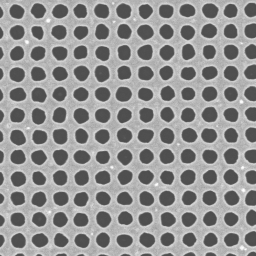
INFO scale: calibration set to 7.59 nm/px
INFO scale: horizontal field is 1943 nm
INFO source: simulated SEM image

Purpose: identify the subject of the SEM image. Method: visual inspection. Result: a regular array of holes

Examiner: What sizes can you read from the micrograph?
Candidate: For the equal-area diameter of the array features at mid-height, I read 110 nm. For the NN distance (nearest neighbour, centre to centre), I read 0.155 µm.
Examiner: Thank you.